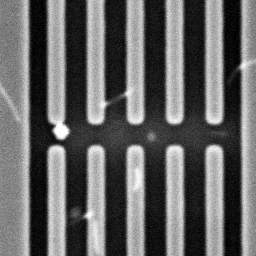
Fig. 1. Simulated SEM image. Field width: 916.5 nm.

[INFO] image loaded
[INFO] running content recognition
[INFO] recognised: groups of lines, slits or small figures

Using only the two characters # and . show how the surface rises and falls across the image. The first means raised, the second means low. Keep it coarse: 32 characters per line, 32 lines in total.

###...##...##...##...##...##..##
###...##...##...##...##...##..##
###...##...##...##...##...##..##
###...##...##...##...##...##..##
####..##...##...##...##...##..##
###...##...##...##...##...##..##
###...##...##...##...##...##..##
###...##...##...##...##...##..##
###...##...##...##...##...##..##
###...##...##...##...##...##..##
###...##...##...##...##...##..##
###...##...##...##...##...##..##
####..##...##...##...##...##..##
####..##...##...##...##...##..##
###...##...##...##...##...##..##
####...#......................##
####...#......................##
####..........................##
####..##...##...##...#....#...##
####..##...##...##...##...##..##
####..##...##...##...##...##..##
###...##...##...##...##...##..##
####..##...##...##...##...##..##
####..##...##...##...##...##..##
####..##...##...##...##...##..##
####..##...##...##...##...##..##
####..##...##...##...##...##..##
####..##...##...##...##...##..##
####..##...##...##...##...##..##
####..##...##...##...##...##..##
####..##...##...##...##...##..##
####..##...##...##...##...##..##